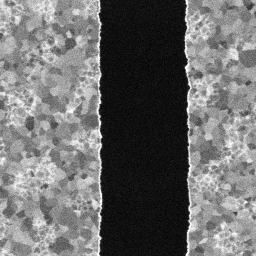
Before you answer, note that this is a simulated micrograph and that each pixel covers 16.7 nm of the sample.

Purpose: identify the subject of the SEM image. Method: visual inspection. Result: one or a few lines or trenches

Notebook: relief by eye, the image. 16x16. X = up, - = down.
XXXXXX------XXXX
XXXXXX------XXXX
XXXXXX------XXXX
XXXXXX------XXXX
XXXXXX------XXXX
XXXXXX------XXXX
XXXXXX------XXXX
XXXXXX------XXXX
XXXXXX------XXXX
XXXXXX------XXXX
XXXXXX------XXXX
XXXXXX------XXXX
XXXXXX------XXXX
XXXXXX------XXXX
XXXXXX------XXXX
XXXXXX------XXXX